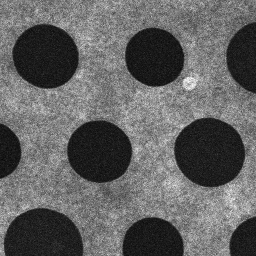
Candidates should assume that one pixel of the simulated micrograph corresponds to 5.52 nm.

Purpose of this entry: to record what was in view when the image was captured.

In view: holes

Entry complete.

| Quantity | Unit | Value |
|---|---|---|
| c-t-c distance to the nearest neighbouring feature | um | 0.602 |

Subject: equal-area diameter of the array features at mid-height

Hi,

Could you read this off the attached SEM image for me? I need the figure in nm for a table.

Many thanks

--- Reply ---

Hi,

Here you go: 357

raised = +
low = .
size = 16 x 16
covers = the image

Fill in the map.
++++++++++++++++
++++++++++++++++
+....+++...+++..
+....+++...+++..
+....+++...+++..
+++++++++++++++.
++++++++++++++++
++++++++++++..++
.+++....+++....+
.+++....+++....+
.++++...+++....+
++++++++++++..++
++++++++++++++++
+...++++++++++++
.....+++...++++.
.....+++...+++..